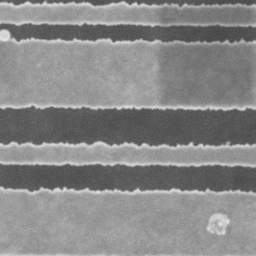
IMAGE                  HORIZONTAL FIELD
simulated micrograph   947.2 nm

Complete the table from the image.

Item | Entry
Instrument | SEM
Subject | lines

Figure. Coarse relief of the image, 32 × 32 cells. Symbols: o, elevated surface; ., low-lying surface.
o..o.o.oooo...oo................
oooooooooooooooooooooooooooooooo
oooooooooooooooooooooooooooooooo
................................
o...............................
oooooooooooooooooooooooooooooooo
oooooooooooooooooooooooooooooooo
oooooooooooooooooooooooooooooooo
oooooooooooooooooooooooooooooooo
oooooooooooooooooooooooooooooooo
oooooooooooooooooooooooooooooooo
oooooooooooooooooooooooooooooooo
oooooooooooooooooooooooooooooooo
ooo..o..oo.ooooooooooooooooooooo
................................
................................
................................
................................
oooooooooooooooooooooooooooooooo
oooooooooooooooooooooooooooooooo
oooooooooooooooooooooooooooooooo
................................
................................
................................
oooooooooooooooooooooooooooooooo
oooooooooooooooooooooooooooooooo
oooooooooooooooooooooooooooooooo
oooooooooooooooooooooooooooooooo
oooooooooooooooooooooooooooooooo
oooooooooooooooooooooooooooooooo
oooooooooooooooooooooooooooooooo
oooooooooooooooooooooooooooooooo